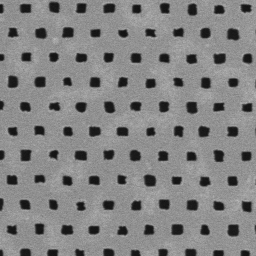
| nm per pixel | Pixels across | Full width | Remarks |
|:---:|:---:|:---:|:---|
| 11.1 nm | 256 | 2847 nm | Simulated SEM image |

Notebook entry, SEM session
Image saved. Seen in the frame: a regular array of holes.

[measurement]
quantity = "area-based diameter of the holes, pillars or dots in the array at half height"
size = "10.8 px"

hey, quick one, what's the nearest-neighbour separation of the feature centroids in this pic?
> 26.9 px